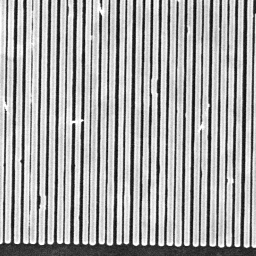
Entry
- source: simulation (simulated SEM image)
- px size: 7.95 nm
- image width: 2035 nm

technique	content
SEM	parallel lines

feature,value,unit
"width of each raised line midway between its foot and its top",35.8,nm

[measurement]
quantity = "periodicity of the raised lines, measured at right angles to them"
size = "67.9 nanometers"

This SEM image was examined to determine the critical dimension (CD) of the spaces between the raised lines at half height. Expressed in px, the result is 3.62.